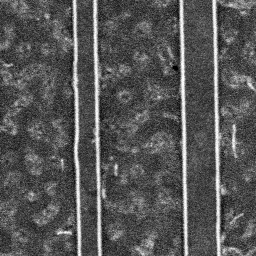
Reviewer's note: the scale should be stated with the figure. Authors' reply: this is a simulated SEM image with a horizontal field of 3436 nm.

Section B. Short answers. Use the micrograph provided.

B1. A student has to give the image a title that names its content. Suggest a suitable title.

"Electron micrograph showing one or a few lines or trenches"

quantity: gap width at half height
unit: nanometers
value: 1160